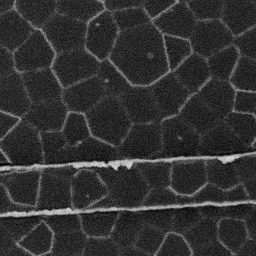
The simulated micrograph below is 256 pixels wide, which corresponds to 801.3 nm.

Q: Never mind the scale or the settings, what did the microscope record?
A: one or a few lines or trenches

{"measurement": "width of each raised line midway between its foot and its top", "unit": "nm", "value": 152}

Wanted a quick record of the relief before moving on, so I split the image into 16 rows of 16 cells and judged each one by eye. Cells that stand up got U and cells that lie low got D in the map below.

DDDDDDDDDDDDDDDD
DDDDDDDDDDDDDDDD
DDDDDDDDDDDDDDDD
DDDDDDDDDDDDDDDD
DDDDDDDDDDDDDDDD
DDDDDDDDDDDDDDDD
DDDDDDDDDDDDDDDD
DDDDDDDDDDDDDDDD
DDDDDDDDDDDDDDDD
DDDDDDDDDDDDDDDD
UUUUUUUUUUUUUUUU
UUUUUUUUUUUUUUUU
UUUUUUUUUUUUUUUU
DDDDDDDDDDDDDDDD
DDDDDDDDDDDDDDDD
DDDDDDDDDDDDDDDD